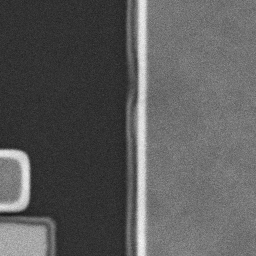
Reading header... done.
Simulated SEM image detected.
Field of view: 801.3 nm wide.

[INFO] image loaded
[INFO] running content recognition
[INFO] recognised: wiring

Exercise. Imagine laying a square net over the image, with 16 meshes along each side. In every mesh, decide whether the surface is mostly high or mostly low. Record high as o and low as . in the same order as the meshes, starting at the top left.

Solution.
.........ooooooo
.........ooooooo
.........ooooooo
.........ooooooo
.........ooooooo
.........ooooooo
.........ooooooo
.........ooooooo
.........ooooooo
.........ooooooo
o........ooooooo
oo.......ooooooo
o........ooooooo
.........ooooooo
.........ooooooo
.........ooooooo